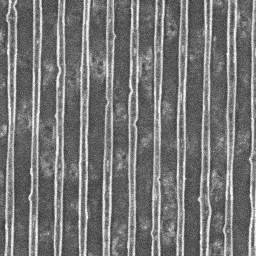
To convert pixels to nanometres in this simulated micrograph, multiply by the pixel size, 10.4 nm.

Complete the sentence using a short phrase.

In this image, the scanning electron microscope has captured parallel lines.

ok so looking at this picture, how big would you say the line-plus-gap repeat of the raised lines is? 0.253 microns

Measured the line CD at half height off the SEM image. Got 76.4 nanometres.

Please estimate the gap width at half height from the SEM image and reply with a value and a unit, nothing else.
0.183 micrometres